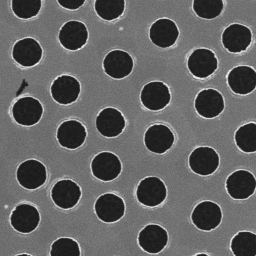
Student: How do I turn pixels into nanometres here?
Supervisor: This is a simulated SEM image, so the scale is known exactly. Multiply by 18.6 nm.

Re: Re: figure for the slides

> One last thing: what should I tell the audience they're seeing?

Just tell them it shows a regular array of holes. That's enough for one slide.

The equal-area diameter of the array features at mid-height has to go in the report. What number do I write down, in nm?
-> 546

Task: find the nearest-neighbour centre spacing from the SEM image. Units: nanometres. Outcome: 773